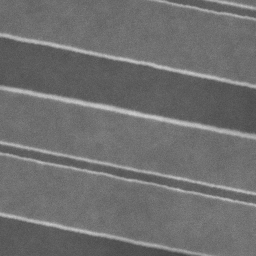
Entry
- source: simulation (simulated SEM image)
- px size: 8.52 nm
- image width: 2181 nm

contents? lines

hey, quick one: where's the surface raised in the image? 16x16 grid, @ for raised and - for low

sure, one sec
@@@@@@@@@@@@@@@@
@@@@@@@@@@@@@@@@
-@@@@@@@@@@@@@@@
------@@@@@@@@@@
-----------@@@@@
----------------
@@@@@-----------
@@@@@@@@@@------
@@@@@@@@@@@@@@@@
@@@@@@@@@@@@@@@@
@@@@@@@@@@@@@@@@
@@@@@@@@@@@@@@@@
@@@@@@@@@@@@@@@@
@@@@@@@@@@@@@@@@
-----@@@@@@@@@@@
----------@@@@@@